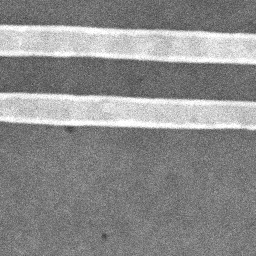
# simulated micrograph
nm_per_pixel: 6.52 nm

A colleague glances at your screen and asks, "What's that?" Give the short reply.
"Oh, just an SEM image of one or a few lines or trenches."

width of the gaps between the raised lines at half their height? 41.1 pixels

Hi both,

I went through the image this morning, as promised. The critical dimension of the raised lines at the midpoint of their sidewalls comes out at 171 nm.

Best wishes